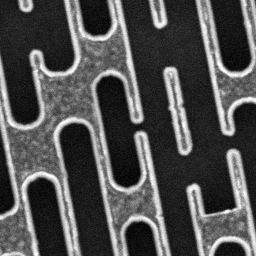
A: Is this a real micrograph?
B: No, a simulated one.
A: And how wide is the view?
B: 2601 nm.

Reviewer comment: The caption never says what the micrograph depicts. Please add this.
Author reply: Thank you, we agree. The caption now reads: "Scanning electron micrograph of parallel lines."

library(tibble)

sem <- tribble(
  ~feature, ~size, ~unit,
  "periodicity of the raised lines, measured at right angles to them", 442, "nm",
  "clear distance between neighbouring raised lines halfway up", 32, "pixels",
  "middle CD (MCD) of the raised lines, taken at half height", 108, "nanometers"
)